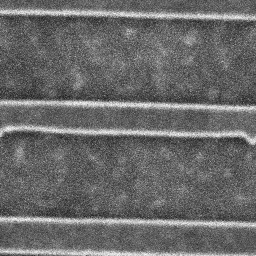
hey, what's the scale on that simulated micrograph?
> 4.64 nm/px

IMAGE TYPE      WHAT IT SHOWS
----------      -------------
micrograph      one or a few lines or trenches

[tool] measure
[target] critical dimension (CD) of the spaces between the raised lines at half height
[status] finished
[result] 412 nanometers